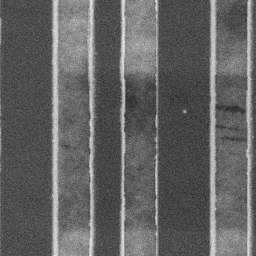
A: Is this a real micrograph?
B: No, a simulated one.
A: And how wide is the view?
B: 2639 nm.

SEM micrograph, lines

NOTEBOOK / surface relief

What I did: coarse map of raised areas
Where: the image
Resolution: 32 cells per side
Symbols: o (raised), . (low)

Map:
ooooooo....oooo.....ooooooo....o
ooooooo....oooo.....ooooooo....o
ooooooo....oooo.....ooooooo....o
ooooooo....oooo.....ooooooo....o
ooooooo....oooo.....ooooooo....o
ooooooo....oooo.....ooooooo....o
ooooooo....oooo.....ooooooo....o
ooooooo....oooo.....ooooooo....o
ooooooo....oooo.....ooooooo....o
ooooooo....oooo.....ooooooo....o
ooooooo.....ooo.....ooooooo....o
ooooooo....oooo.....ooooooo....o
ooooooo....oooo.....ooooooo....o
ooooooo....oooo.....ooooooo....o
ooooooo....oooo.....ooooooo....o
ooooooo....oooo.....ooooooo....o
ooooooo....oooo.....ooooooo....o
ooooooo....oooo.....ooooooo....o
ooooooo....oooo.....ooooooo....o
ooooooo....oooo.....ooooooo....o
ooooooo....oooo.....ooooooo....o
ooooooo....oooo.....ooooooo....o
ooooooo....oooo.....ooooooo....o
ooooooo....oooo.....ooooooo....o
ooooooo....oooo.....ooooooo....o
ooooooo.....ooo.....ooooooo....o
ooooooo.....ooo.....ooooooo....o
ooooooo....oooo.....ooooooo....o
ooooooo....oooo.....ooooooo....o
ooooooo....oooo.....ooooooo....o
ooooooo....oooo.....ooooooo....o
ooooooo....oooo.....ooooooo....o